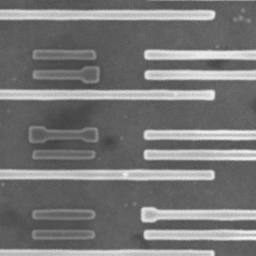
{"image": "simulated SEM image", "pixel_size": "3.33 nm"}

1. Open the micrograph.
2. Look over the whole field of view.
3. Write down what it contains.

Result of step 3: wiring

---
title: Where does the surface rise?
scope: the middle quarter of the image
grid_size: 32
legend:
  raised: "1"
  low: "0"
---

00000000000000000000000000000000
00001111100000000000000000000000
11111111100000000000111111111111
11111111100000000000111111111111
00000111000000000000000000000000
00000000000000000000000000000000
00000000000000000000000000000000
11111111111111111111111111111111
11111111111111111111111111111111
00000000000000000000000000000000
00000000000000000000000000000000
00000000000000000000000000000000
00000000000000000000000000000000
00000000000000000000000000000000
00000000000000000000000000000000
00000000000000000000000000000000
00001111000000000000000000000000
11111111000000000000111111111111
11111111000000000000111111111111
00000000000000000000000000000000
00000000000000000000000000000000
00000000000000000000000000000000
11111111000000000000111111111111
11111110000000000000111111111111
00000000000000000000000000000000
00000000000000000000000000000000
00000000000000000000000000000000
11111111111111111111111111111111
11111111111111111111111111111111
00000000000000000000000000000000
00000000000000000000000000000000
00000000000000000000000000000000